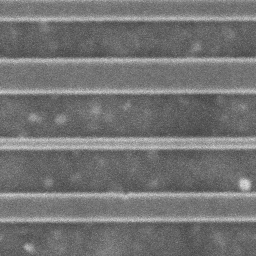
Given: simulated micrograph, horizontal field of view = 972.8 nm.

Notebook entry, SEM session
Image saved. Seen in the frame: one or a few lines or trenches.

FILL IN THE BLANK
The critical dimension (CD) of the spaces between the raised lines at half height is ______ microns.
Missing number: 0.174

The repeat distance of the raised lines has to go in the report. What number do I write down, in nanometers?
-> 250